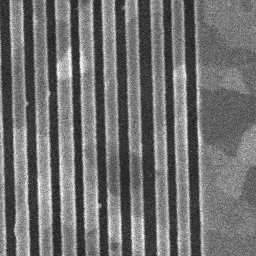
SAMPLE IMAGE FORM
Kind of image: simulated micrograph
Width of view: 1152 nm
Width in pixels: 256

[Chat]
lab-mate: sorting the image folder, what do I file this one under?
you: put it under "parallel lines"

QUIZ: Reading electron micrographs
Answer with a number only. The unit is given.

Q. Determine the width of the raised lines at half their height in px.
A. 12.1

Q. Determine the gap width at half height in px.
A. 10.5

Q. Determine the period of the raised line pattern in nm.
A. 104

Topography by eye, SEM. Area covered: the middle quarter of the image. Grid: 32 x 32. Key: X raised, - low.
XX--XXX---XXX---XXX---XXX---XX--
XX--XXX---XXX---XXX---XXX---XX--
XX---XX---XXX---XXX---XXX---XX--
XX--XXX---XXX---XXX---XXX---XX--
XX--XXX---XXX---XXX---XXX---XX--
XX--XXX---XXX---XXX----XX---XX--
XX--XXX---XXX---XXX----XX---XX--
XX--XXX---XXX---XXX----XX---XX--
XX--XXX---XXX---XXX----XX---XX--
XX--XXX----XX---XXX----XX---XX--
XX---XXX--XXX---XXX----XX---XX--
XX---XXX---XX---XXX----XX---XX--
XX---XXX---XX---XXX----XX---XXX-
XX---XXX--XXX---XXX----XX---XXX-
XX---XXX--XXX---XXX----XX---XXX-
XX---XXX---XX---XXX----XX---XXX-
XX---XXX---XX---XXX----XX---XX--
XX---XXX---XX---XXX----XX---XX--
XX---XXX---XX---XXX----XX---XX--
XX---XXX---XX---XXX----XX---XXX-
XX---XXX---XX---XXX----XX---XXX-
XX---XXX---XX----XX----XX---XXX-
XX---XXX---XX----XX----XXX--XXX-
XX---XXX---XXX---XX----XXX--XXX-
XX---XXX---XXX---XX----XX---XXX-
XX---XXX---XXX---XX----XX---XXX-
XX---XXX---XXX---XX----XX---XXX-
XX---XXX---XXX---XX----XXX--XXX-
XX---XXX---XXX---XX----XXX--XXX-
XX---XXX---XXX---XXX---XXX--XXX-
XX---XXX---XXX---XX----XXX--XXX-
XX---XXX---XXX---XX----XXX--XXX-